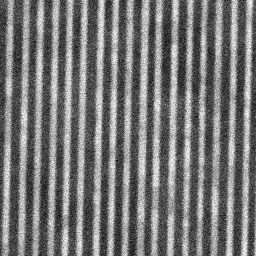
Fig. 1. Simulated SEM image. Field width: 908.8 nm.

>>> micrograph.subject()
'parallel lines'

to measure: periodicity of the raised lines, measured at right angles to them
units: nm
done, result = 53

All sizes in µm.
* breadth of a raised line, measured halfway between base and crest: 0.0178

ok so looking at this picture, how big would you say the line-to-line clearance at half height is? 0.036 um